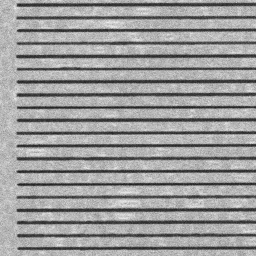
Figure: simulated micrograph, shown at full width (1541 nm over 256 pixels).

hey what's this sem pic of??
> parallel lines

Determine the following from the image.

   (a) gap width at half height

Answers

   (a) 21.1 nanometers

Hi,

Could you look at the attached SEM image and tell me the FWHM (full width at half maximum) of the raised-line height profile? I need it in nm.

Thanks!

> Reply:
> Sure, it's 57.9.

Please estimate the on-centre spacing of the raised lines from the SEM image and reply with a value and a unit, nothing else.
0.0771 µm